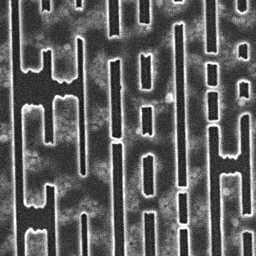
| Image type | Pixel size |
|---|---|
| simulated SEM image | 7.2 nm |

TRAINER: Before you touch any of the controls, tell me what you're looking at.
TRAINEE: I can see parallel lines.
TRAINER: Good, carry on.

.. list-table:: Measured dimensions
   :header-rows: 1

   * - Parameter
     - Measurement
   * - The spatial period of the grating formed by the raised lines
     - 236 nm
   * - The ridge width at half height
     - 162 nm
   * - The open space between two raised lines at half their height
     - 67.5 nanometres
